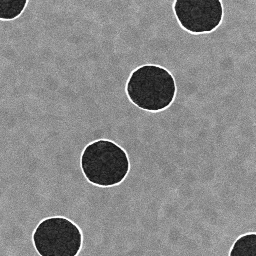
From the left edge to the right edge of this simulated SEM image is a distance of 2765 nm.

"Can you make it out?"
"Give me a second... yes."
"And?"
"holes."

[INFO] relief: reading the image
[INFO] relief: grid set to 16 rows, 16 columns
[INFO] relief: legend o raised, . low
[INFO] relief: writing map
.oooooooooo...oo
ooooooooooo...oo
oooooooooooooooo
oooooooooooooooo
oooooooo..oooooo
oooooooo...ooooo
oooooooo...ooooo
oooooooooooooooo
oooooooooooooooo
ooooo...oooooooo
ooooo...oooooooo
oooooo.ooooooooo
oooooooooooooooo
oooooooooooooooo
oo...ooooooooooo
oo...oooooooooo.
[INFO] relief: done